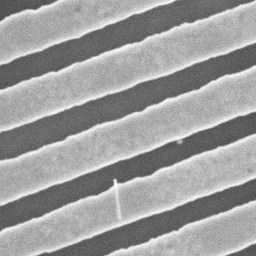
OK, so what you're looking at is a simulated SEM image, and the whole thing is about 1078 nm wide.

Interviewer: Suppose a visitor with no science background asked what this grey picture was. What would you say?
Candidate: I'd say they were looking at lines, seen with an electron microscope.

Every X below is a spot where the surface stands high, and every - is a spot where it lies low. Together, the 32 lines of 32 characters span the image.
------XXXXXXXXXXXXXXX----------X
---XXXXXXXXXXXXXXX----------XXXX
XXXXXXXXXXXXXXX----------XXXXXXX
XXXXXXXXXXXXX---------XXXXXXXXXX
XXXXXXXXXX---------XXXXXXXXXXXXX
XXXXXXX----------XXXXXXXXXXXXXX-
XXXX---------XXXXXXXXXXXXXXXX---
XX---------XXXXXXXXXXXXXXX------
--------XXXXXXXXXXXXXXX--------X
-----XXXXXXXXXXXXXXX--------XXXX
--XXXXXXXXXXXXXXX---------XXXXXX
XXXXXXXXXXXXXXX---------XXXXXXXX
XXXXXXXXXXX----------XXXXXXXXXXX
XXXXXXXXX---------XXXXXXXXXXXXXX
XXXXXX----------XXXXXXXXXXXXXX--
XXX----------XXXXXXXXXXXXXX-----
-----------XXXXXXXXXXXXXX-------
--------XXXXXXXXXXXXXX--------XX
-----XXXXXXXXXXXXXXX-------XXXXX
--XXXXXXXXXXXXXXX-------XXXXXXXX
XXXXXXXXXXXXXX--------XXXXXXXXXX
XXXXXXXXXXX--------XXXXXXXXXXXXX
XXXXXXXXX--------XXXXXXXXXXXXXX-
XXXXXX--------XXXXXXXXXXXXXX----
XXX---------XXXXXXXXXXXXXX------
---------XXXXXXXXXXXXXX--------X
------XXXXXXXXXXXXXX--------XXXX
----XXXXXXXXXXXXX--------XXXXXXX
-XXXXXXXXXXXXX---------XXXXXXXXX
XXXXXXXXXXXX--------XXXXXXXXXXXX
XXXXXXXXX---------XXXXXXXXXXXXXX
XXXXXX--------XXXXXXXXXXXXXXX---